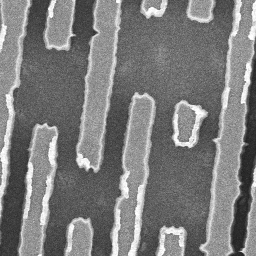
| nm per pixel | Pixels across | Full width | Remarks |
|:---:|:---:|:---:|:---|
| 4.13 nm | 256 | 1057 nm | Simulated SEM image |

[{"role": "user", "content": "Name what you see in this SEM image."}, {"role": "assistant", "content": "parallel lines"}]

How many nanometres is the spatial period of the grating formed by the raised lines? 191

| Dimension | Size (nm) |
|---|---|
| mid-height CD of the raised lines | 102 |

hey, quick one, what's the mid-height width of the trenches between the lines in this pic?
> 86.5 nm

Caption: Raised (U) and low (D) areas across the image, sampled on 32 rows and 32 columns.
UUUUDDUUUDDDUUUDDDUUUDDDUUUDDUUU
UUUUDDUUUDDDUUUDDDUUDDDUUUDDDUUU
UUUDDDUUUDDDUUUDDDDDDDDDDUDDDUUU
UUUDDDUUUDDDUUUDDDDDDDDDDDDDDUUU
UUUDDDUUUDDDUUUDDDDDDDDDDDDDDUUU
UUUDDDUUUDDUUUDDDDDDDDDDDDDDDUUU
UUUDDDDDDDDUUUDDDDDDDDDDDDDDDUUU
UUDDDDDDDDDUUUDDDDDDDDDDDDDDUUUU
UUDDDDDDDDDUUUDDDDDDDDDDDDDDUUUD
UUDDDDDDDDDUUUDDDDDDDDDDDDDDUUUD
UUDDDDDDDDDUUUDDDDDDDDDDDDDDUUUD
UUDDDDDDDDDUUUDDDDDDDDDDDDDDUUUD
UUDDDDDDDDDUUUDDDUUDDDDDDDDDUUUD
UUDDDDDDDDDUUUDDUUUDDDUUUDDDUUUD
UUDDDDDDDDUUUDDDUUUDDDUUUDDDUUUD
UUDDDDDDDDUUUDDDUUUDDDUUUDDDUUUD
UDDDUUUDDDUUUDDDUUUDDDUUUDDDUUUD
UDDDUUUDDDUUUDDDUUUDDDUUUDDUUUUD
UDDDUUUDDDUUUDDDUUDDDDDDDDDUUUDD
UDDDUUUDDDUUUDDUUUDDDDDDDDDUUUDD
UDDDUUUDDDUUDDDUUUDDDDDDDDDUUUDD
UDDUUUUDDDDDDDDDUUDDDDDDDDDUUUDD
UDDUUUDDDDDDDDDUUUDDDDDDDDDUUUDD
UDDUUUDDDDDDDDDUUUDDDDDDDDDUUUDU
DDDUUUDDDDDDDDDUUUDDDDDDDDDUUUDU
DDDUUUDDDDDDDDDUUUDDDDDDDDDUUDDU
DDDUUUDDDDDDDDUUUUDDDDDDDDUUUDDU
DDDUUUDDDUUDDDUUUUDDDDDDDDUUUDDU
DDDUUUDDDUUDDDUUUUDDDDDDDDUUUDDU
DDDUUDDDUUUUDDUUUDDDUUUDDDUUUDDU
DDDUUDDDUUUUDDUUUDDDUUUDDUUUUDDU
DDUUUDDDUUUDDDUUUDDDUUUDDUUUUDUU